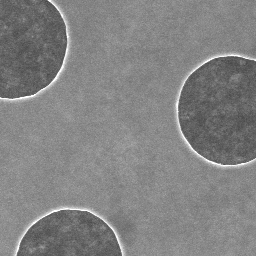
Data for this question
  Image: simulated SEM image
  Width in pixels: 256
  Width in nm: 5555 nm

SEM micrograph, holes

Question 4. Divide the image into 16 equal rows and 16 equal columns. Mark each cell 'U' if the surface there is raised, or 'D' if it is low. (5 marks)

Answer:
DDDDUUUUUUUUUUUU
DDDDUUUUUUUUUUUU
DDDDUUUUUUUUUUUU
DDDDUUUUUUUUUUUU
DDDDUUUUUUUUDDDD
DDDUUUUUUUUDDDDD
UUUUUUUUUUUDDDDD
UUUUUUUUUUUDDDDD
UUUUUUUUUUUUDDDD
UUUUUUUUUUUUDDDD
UUUUUUUUUUUUUUUU
UUUUUUUUUUUUUUUU
UUUUUUUUUUUUUUUU
UUUDDDUUUUUUUUUU
UUDDDDDUUUUUUUUU
UDDDDDDDUUUUUUUU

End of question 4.